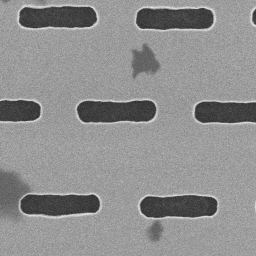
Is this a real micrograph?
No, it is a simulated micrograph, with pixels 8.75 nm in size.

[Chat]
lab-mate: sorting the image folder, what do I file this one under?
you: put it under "holes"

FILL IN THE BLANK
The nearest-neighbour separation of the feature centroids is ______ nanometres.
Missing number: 958